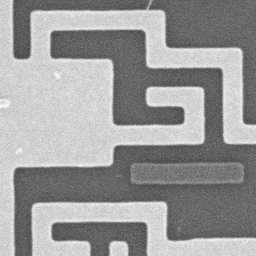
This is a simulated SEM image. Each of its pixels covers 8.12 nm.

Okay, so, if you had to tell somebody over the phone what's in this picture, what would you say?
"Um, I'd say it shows wiring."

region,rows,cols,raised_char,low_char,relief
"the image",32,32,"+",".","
++..............................
++..++++++++++++++++............
++..+++++++++++++++++...........
++..+++++++++++++++++...........
++..++............+++...........
++..++............+++...........
++..++............++++++++++++..
++.++++++.........++++++++++++..
++++++++++++++.............+++..
++++++++++++++..............++..
++++++++++++++..............++..
++++++++++++++....+++++++...++..
++++++++++++++....+++++++...++..
++++++++++++++.........++...++..
++++++++++++++.........++...++..
++++++++++++++.........++...+++.
+++++++++++++++++++++++++...++++
+++++++++++++++++++++++++...++++
++++++++++++++..................
++++++++++++++..................
++++++++++++++...+++++++++++++..
++..............++++++++++++++..
++..............++++++++++++++..
++..............................
++..............................
++...++++++++++++++++...........
++..+++++++++++++++++...........
++..+++++++++++++++++...........
++..++............+++...........
++..++.............++...........
++..+++++++...++...+++++++++++++
++..+++++++...++..++++++++++++++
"